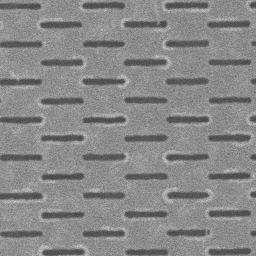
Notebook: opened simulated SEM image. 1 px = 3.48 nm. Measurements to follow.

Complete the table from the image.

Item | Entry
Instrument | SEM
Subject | a regular array of holes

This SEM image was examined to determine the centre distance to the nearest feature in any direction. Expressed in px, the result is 37.4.